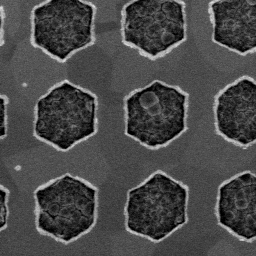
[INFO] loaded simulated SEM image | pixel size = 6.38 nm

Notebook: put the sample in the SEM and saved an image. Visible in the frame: holes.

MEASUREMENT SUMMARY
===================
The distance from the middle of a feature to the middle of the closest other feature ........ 0.578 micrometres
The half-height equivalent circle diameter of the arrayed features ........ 0.396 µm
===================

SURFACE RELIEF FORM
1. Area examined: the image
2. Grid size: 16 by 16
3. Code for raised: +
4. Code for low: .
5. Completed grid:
++....++...++...
++....++...++...
++....++...+++..
+++.++++++++++++
++++++++++++++++
+++..++++..+++..
++....++....++..
++....++....++..
++...+++...+++..
++++++++++++++++
++++++++++++++++
+++..++++..+++..
++....++....++..
++....++....++..
+++..+++...++++.
++++++++++++++++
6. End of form